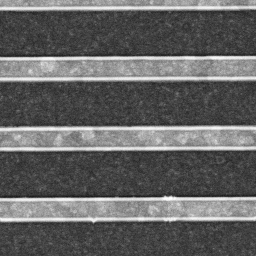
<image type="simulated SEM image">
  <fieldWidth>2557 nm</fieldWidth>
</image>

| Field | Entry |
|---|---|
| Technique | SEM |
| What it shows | one or a few lines or trenches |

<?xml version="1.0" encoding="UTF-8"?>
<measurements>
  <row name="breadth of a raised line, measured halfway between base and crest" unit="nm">204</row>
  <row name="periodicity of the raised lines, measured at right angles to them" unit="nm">703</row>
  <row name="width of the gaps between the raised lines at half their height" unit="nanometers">496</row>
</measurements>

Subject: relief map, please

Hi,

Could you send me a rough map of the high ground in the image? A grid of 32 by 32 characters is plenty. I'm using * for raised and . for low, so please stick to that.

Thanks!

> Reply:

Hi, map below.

********************************
................................
................................
................................
................................
................................
................................
********************************
********************************
********************************
................................
................................
................................
................................
................................
................................
********************************
********************************
*****************...............
................................
................................
................................
................................
................................
................................
********************************
********************************
...........*....................
................................
................................
................................
................................